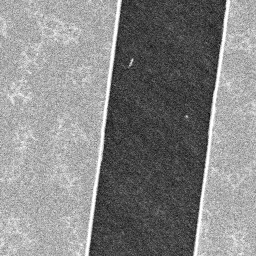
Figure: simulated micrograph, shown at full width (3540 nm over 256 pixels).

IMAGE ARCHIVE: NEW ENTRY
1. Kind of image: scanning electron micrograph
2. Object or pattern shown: one or a few lines or trenches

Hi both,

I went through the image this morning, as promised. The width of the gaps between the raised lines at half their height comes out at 1480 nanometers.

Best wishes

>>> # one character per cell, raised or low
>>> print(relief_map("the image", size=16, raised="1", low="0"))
1111111000000011
1111111000000011
1111111000000011
1111111000000011
1111111000000011
1111111000000011
1111111000000111
1111111000000111
1111110000000111
1111110000000111
1111110000000111
1111110000000111
1111110000000111
1111110000000111
1111110000001111
1111100000001111